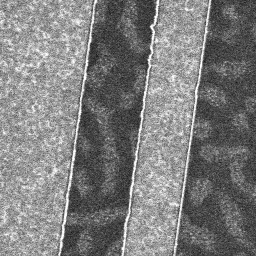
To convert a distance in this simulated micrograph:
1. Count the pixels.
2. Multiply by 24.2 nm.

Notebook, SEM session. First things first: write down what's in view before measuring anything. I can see one or a few lines or trenches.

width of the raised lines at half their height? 1530 nm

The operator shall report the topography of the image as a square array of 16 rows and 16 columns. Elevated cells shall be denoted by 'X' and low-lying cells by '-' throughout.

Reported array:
------XXXX---XXX
------XXXX---XXX
------XXXX---XXX
-----XXXX----XXX
-----XXXX---XXXX
-----XXXX---XXXX
-----XXXX---XXXX
-----XXXX---XXXX
-----XXXX---XXXX
-----XXXX---XXXX
----XXXX----XXXX
----XXXX----XXXX
----XXXX---XXXXX
----XXXX---XXXXX
----XXXX---XXXXX
----XXXX---XXXXX